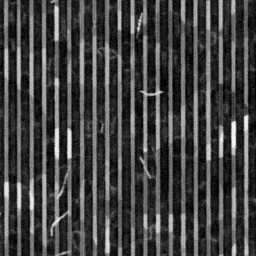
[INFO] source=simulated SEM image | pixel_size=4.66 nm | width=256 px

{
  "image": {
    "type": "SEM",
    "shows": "parallel lines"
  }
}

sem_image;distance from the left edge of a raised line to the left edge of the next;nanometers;58.8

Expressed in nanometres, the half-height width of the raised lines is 11.6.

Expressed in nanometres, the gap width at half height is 45.4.